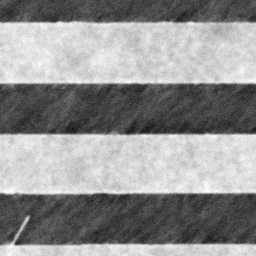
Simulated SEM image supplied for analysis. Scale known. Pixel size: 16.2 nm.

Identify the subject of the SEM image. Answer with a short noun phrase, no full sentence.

lines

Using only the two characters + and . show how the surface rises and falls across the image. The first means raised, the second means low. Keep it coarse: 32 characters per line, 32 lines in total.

................................
................................
................................
++++++++++++++++++++++++++++++++
++++++++++++++++++++++++++++++++
++++++++++++++++++++++++++++++++
++++++++++++++++++++++++++++++++
++++++++++++++++++++++++++++++++
++++++++++++++++++++++++++++++++
++++++++++++++++++++++++++++++++
................................
................................
................................
................................
................................
................................
................................
++++++++++++++++++++++++++++++++
++++++++++++++++++++++++++++++++
++++++++++++++++++++++++++++++++
++++++++++++++++++++++++++++++++
++++++++++++++++++++++++++++++++
++++++++++++++++++++++++++++++++
++++++++++++++++++++++++++++++++
................................
................................
................................
................................
................................
................................
................................
++++++++++++++++++++++++++++++++